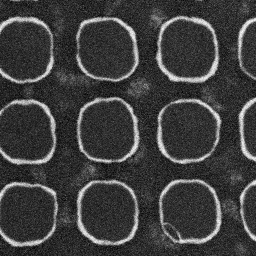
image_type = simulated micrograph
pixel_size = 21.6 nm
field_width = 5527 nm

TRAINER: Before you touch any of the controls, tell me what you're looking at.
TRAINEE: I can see raised bodies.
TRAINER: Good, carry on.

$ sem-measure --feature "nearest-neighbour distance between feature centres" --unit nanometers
1740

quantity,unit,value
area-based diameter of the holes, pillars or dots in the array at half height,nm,1350